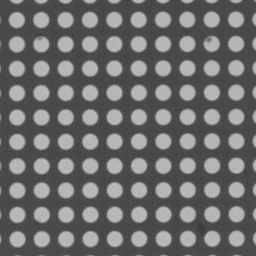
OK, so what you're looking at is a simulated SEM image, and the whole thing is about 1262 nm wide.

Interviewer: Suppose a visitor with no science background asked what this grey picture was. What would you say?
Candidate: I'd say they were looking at an array of small figures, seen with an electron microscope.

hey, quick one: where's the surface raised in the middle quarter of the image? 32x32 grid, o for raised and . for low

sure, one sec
oo...ooo...ooo...ooo...oooo..ooo
oo...ooo...ooo...ooo...oooo..ooo
oo...ooo...ooo...ooo....oo....oo
................................
................................
o.....o.....oo....oo....oo....oo
oo...ooo...ooo...ooo...oooo..ooo
oo...ooo...ooo...oooo..oooo..ooo
oo...ooo...ooo...ooo...ooo....oo
................................
................................
o.....o.....o.....o.....o.....oo
oo...ooo...ooo...oooo..oooo..ooo
oo...ooo...oooo..oooo..oooo..ooo
oo...ooo...ooo...ooo...ooo...ooo
................................
................................
................................
oo...ooo...ooo...oooo..oooo..ooo
oo...ooo...oooo..oooo..oooo..ooo
oo...ooo...ooo...ooo...ooo...ooo
................................
................................
................................
oo...ooo...ooo...ooo...oooo..ooo
oo...ooo...oooo..oooo..oooo..ooo
oo...ooo...ooo...ooo...oooo..ooo
................................
................................
................................
oo...ooo...ooo...ooo...oooo..ooo
oo...ooo...oooo..oooo..oooo..ooo